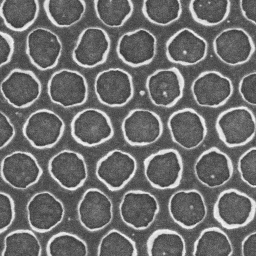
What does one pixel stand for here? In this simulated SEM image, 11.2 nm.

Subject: a regular array of holes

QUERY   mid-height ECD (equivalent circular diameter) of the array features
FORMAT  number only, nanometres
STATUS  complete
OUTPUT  399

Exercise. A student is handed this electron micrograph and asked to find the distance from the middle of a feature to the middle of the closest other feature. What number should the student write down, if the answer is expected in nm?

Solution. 512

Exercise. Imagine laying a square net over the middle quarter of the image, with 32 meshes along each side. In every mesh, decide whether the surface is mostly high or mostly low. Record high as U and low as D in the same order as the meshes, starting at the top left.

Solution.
UUUUUUUUUUUUUUUUUUUUUUUUUUUUUUUU
UUUUUUUUUUUUDDUUUUUUUUUUUUDUUUUU
DDDUUUUUUDDDDDDDUUUUUUUDDDDDUUUU
DDDDDUUUDDDDDDDDUUUUUDDDDDDDDUUU
DDDDDUUUDDDDDDDDDUUUUDDDDDDDDUUU
DDDDDUUUDDDDDDDDDUUUUDDDDDDDDUUU
DDDDDDUUDDDDDDDDDUUUUDDDDDDDDUUU
DDDDDDUUDDDDDDDDDUUUUUDDDDDDDUUU
DDDDDUUUUDDDDDDDUUUUUUDDDDDDUUUU
DDDDDUUUUUDDDDDUUUUUUUDDDDDUUUUU
DDUUUUUUUUUUUUUUUUUUUUUUUUUUUUUU
UUUUUUDDUUUUUUUUUUUUUUUUUUUUUUDU
UUUUDDDDDDUUUUUUUDDDDDUUUUUUDDDD
UUUDDDDDDDDUUUUUDDDDDDDUUUUDDDDD
UUDDDDDDDDDUUUUDDDDDDDDDUUDDDDDD
UUDDDDDDDDDUUUUDDDDDDDDDUUUDDDDD
UUDDDDDDDDDDUUUDDDDDDDDDUUUDDDDD
UUDDDDDDDDDDUUUDDDDDDDDDUUUDDDDD
UUUDDDDDDDDUUUUUDDDDDDDUUUUDDDDD
UUUUUDDDDUUUUUUUUDDDDDUUUUUUDDDD
UUUUUUUUUUUUUUUUUUUUUUUUUUUUUUDD
UUUUUUUUUUUUUUUUUUUUUUUUUUUUUUUU
DDDUUUUUUUUUDDDDUUUUUUUUDDDDUUUU
DDDDUUUUUUUDDDDDDUUUUUDDDDDDDUUU
DDDDDUUUUDDDDDDDDDUUUDDDDDDDDUUU
DDDDDUUUDDDDDDDDDDUUUDDDDDDDDUUU
DDDDDUUUDDDDDDDDDUUUDDDDDDDDDUUU
DDDDDDUUDDDDDDDDDUUUUDDDDDDDDUUU
DDDDDUUUUDDDDDDDUUUUUDDDDDDDDUUU
DDDDUUUUUUDDDDDUUUUUUUDDDDDDUUUU
DDDUUUUUUUUDDDDUUUUUUUUDDDUUUUUU
UUUUUUUDUUUUUUUUUUUUUUUUUUUUUUUU